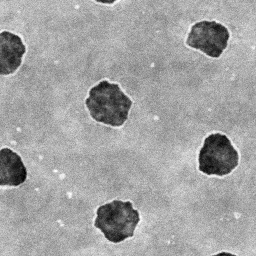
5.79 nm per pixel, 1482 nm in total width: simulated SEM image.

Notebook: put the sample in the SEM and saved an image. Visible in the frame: holes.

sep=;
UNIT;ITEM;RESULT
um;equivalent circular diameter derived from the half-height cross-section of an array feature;0.25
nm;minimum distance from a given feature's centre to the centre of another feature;680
